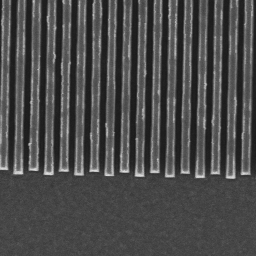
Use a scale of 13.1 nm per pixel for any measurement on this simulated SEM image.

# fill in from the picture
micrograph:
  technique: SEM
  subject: parallel lines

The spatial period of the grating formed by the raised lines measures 199 nm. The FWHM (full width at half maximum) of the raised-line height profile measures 105 nm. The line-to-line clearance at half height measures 93.6 nanometers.